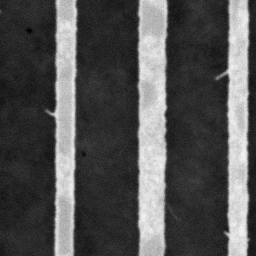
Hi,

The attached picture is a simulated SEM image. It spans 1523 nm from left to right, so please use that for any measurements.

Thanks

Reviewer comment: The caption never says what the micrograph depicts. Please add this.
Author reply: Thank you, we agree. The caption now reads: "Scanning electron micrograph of lines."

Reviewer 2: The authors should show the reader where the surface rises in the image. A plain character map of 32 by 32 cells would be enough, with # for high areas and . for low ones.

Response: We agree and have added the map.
.......##........####........##.
.......###.......####........##.
.......##........####........##.
.......###.......####........##.
.......##........####........##.
.......##........####........##.
.......##........####........##.
.......##........####........##.
.......##........####........##.
.......##........####........##.
.......##........####........##.
.......##........####........##.
.......##........####........##.
.......##........####........##.
.......##........###.........##.
.......##........####........##.
.......##........####........##.
.......##........####........##.
.......##........####........##.
.......##........####........##.
.......##........####........##.
.......##........###.........##.
.......##........###.........##.
.......##........####........##.
.......##........###.........##.
.......##........###.........##.
.......##........###.........##.
.......##........###.........##.
.......##........###.........##.
.......##.........##.........##.
.......##........####........##.
.......##........###.........##.